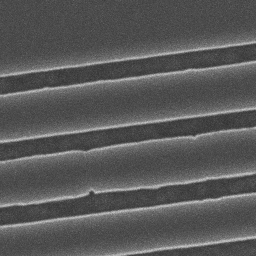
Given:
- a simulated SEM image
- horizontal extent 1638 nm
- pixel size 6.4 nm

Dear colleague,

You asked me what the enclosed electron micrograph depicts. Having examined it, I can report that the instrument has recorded one or a few lines or trenches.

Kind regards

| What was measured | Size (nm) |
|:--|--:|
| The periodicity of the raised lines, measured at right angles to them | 414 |